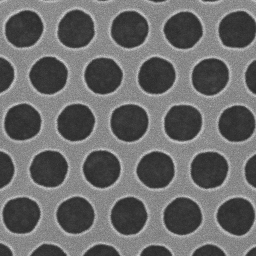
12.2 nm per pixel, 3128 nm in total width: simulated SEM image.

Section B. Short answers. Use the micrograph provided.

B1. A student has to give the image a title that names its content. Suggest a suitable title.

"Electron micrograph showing a regular array of holes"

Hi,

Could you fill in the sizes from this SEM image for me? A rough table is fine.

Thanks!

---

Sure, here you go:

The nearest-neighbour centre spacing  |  649 nm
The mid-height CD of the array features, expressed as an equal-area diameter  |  0.464 microns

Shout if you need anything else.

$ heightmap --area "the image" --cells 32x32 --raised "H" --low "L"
HHHHHHHHHHHHHHHHHHHHHHHHHHHHHHHH
HHLLHHHHHLHHHHHLLHHHHHLLHHHHHLLH
HLLLLHHHLLLLHHLLLLHHHLLLLHHHLLLL
HLLLLHHLLLLLHHLLLLLHLLLLLHHLLLLL
HLLLLHHLLLLLHHLLLLHHHLLLLHHLLLLL
HLLLHHHHLLLHHHHLLLHHHLLLHHHHLLLH
HHHHHHHHHHHHHHHHHHHHHHHHHHHHHHHH
LHHHHLLHHHHLLLHHHHLLLHHHHLLLHHHH
LLHHLLLLHHHLLLLHHHLLLLHHLLLLLHHL
LLHHLLLLHHHLLLLHHLLLLLHHLLLLLHHL
LHHHLLLLHHHLLLLHHLLLLLHHLLLLHHHL
HHHHHLLHHHHHLLHHHHLLLHHHHLLHHHHL
HHHHHHHHHHHHHHHHHHHHHHHHHHHHHHHH
HLLLHHHHLLLHHHHLLLHHHLLLHHHHLLLH
HLLLLHHLLLLLHHLLLLHHHLLLLHHLLLLL
LLLLLHHLLLLLHHLLLLLHHLLLLHHLLLLL
HLLLLHHLLLLHHHLLLLHHHLLLLHHLLLLL
HHLHHHHHLLHHHHHLLHHHHHLLHHHHLLLH
HHHHHHHHHHHHHHHHHHHHHHHHHHHHHHHH
LHHHHLLLHHHLLLHHHHLLLHHHLLLLHHHH
LLHHLLLLLHLLLLLHHLLLLLHHLLLLHHHL
LLHHLLLLHHLLLLLHHLLLLLHHLLLLHHHL
LHHHLLLLHHHLLLLHHLLLLLHHLLLLHHHL
HHHHHHLHHHHHLHHHHHHLHHHHHLLHHHHH
HHHHHHHHHHHHHHHHHHHHHHHHHHHHHHHH
HLLLLHHHLLLHHHLLLLHHHLLLLHHHLLLH
LLLLLHHLLLLLHHLLLLHHHLLLLHHLLLLL
LLLLLHHLLLLLHHLLLLHHLLLLLHHLLLLL
HLLLHHHHLLLHHHLLLLHHHLLLLHHHLLLH
HHHHHHHHHHHHHHHHHHHHHHHHHHHHHHHH
HHHHHLHHHHHHHHHHHHHHHHHHHHHHHHHH
LHHHLLLLHHHLLLLHHHLLLHHHLLLLHHHL